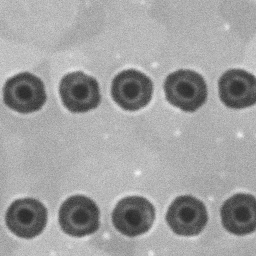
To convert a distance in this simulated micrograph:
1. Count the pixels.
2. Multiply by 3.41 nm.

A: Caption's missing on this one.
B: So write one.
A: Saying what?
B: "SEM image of a regular array of ring-shaped grooves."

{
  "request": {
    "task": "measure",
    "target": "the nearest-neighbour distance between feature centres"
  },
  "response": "53.5 pixels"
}